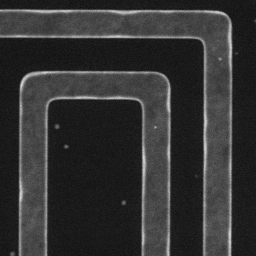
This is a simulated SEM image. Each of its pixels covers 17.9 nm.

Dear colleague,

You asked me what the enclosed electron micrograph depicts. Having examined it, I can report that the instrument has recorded groups of lines, slits or small figures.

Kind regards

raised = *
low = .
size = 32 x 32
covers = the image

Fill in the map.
................................
***************.***********.....
*****************************...
*****************************...
*****************************...
.........................****...
..........................***...
..........................***...
..........................***...
...******************.....***...
...******************.....***...
...******************.....***...
...****..........****.....***...
...***............***.....***...
...***............***.....***...
...***............***.....***...
...***............***.....***...
...***............***.....***...
...***............***.....***...
...***............***.....***...
...***............***.....***...
...***............***.....***...
...***............***.....***...
...***............***.....***...
...***............***.....***...
..****............***.....***...
..****............***.....***...
..****............***....****...
..****............***....****...
..****............***....****...
..****............***....****...
..****............***....****...